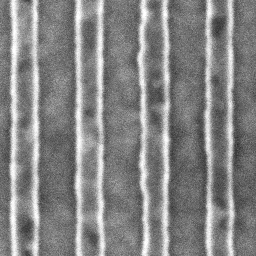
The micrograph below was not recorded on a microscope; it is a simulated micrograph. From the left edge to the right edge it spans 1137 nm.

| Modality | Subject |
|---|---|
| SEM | one or a few lines or trenches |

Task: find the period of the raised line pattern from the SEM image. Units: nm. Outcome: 288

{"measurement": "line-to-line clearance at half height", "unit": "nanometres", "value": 181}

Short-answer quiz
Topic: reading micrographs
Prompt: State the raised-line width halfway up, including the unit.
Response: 24.1 pixels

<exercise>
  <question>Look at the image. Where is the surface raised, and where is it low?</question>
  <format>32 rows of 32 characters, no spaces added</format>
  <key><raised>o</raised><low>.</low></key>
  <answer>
..ooo.....ooo.....ooo.....ooo...
..ooo.....ooo.....ooo.....ooo...
..ooo.....ooo.....ooo.....ooo...
..oo......ooo.....ooo.....ooo...
..oo......ooo.....ooo.....ooo...
..ooo.....ooo.....ooo.....ooo...
..ooo.....ooo.....ooo.....ooo...
..ooo.....ooo....oooo.....ooo...
..ooo.....ooo.....ooo.....ooo...
..ooo.....ooo.....ooo.....ooo...
..ooo.....ooo.....ooo.....ooo...
..ooo.....ooo.....ooo.....ooo...
..ooo.....ooo.....ooo.....ooo...
..ooo.....ooo.....ooo.....ooo...
..ooo.....ooo.....ooo.....ooo...
..ooo.....ooo.....ooo.....ooo...
..ooo.....ooo.....ooo.....ooo...
..ooo.....ooo.....ooo.....ooo...
..ooo.....ooo.....ooo.....ooo...
..ooo.....ooo.....ooo.....ooo...
.oooo.....ooo.....ooo.....ooo...
.oooo.....ooo.....ooo.....ooo...
..ooo.....ooo.....ooo.....ooo...
..ooo.....ooo.....ooo.....ooo...
..oo......ooo.....ooo.....ooo...
.oooo.....ooo.....ooo.....ooo...
.oooo.....ooo.....ooo.....ooo...
.oooo.....ooo.....ooo.....ooo...
..ooo.....ooo.....ooo.....ooo...
..ooo.....ooo.....ooo.....ooo...
..ooo.....ooo.....ooo.....ooo...
..ooo.....ooo.....ooo.....ooo...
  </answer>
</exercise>